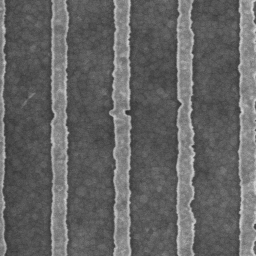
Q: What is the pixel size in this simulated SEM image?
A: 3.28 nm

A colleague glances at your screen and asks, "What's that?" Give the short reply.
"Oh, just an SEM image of one or a few lines or trenches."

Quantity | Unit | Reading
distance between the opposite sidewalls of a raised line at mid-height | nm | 45.9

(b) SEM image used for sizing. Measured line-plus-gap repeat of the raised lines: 206 nanometres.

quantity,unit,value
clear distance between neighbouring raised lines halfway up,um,0.16